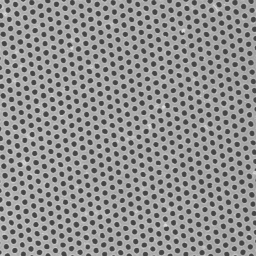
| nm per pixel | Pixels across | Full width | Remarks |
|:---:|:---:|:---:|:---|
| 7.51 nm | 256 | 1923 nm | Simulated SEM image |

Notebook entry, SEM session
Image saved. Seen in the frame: a regular array of holes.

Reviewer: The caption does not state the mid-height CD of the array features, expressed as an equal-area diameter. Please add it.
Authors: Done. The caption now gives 38.8 nanometres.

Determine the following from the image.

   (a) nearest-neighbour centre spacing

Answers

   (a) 67.6 nm